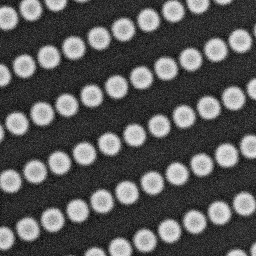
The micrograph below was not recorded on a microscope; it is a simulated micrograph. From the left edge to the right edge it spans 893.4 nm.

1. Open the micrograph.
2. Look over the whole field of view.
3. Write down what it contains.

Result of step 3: a regular array of raised bodies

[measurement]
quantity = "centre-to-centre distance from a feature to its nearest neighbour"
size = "0.0917 micrometres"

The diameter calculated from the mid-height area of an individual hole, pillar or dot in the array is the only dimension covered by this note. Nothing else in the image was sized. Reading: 68.6 nm